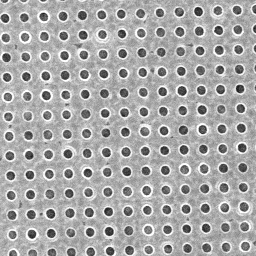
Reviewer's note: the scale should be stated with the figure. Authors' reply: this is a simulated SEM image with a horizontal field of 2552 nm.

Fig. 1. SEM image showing a regular array of holes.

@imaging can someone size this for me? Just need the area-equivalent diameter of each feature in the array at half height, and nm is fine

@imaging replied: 97.4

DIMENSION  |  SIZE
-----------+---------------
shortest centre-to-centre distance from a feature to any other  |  148 nanometers